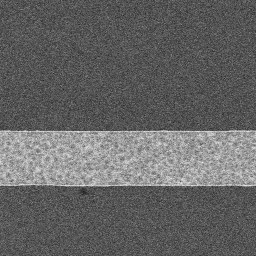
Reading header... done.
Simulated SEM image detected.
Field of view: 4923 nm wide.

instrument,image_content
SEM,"one or a few lines or trenches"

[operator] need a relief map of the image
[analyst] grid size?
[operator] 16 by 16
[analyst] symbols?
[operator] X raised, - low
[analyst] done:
----------------
----------------
----------------
----------------
----------------
----------------
----------------
----------------
XXXXXXXXXXXXXXXX
XXXXXXXXXXXXXXXX
XXXXXXXXXXXXXXXX
XXXXXXXXXXXXXXXX
----------------
----------------
----------------
----------------